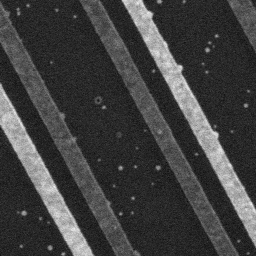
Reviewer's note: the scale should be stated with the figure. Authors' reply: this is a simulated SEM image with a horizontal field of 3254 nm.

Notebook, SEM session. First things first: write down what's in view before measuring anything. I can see lines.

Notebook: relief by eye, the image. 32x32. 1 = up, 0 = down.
00000000001110001100000000000110
10000000000110001110000000000111
10000000000111000110000000000011
11000000000011000111000000000011
11000000000011100011000000000001
11100000000001100011100000000001
01100000000000110001100000000000
01110000000000111001110000000000
00110000000000011000110000000000
00111000000000011100111000000000
00011100000000001100011000000000
10011100000000001110001100000000
10001110000000000110001110000000
11000110000000000111000110000000
11000111000000000011000110000000
11100011000000000011100011000000
01100011100000000001100011100000
01110001100000000001110001100000
00110001110000000000110001110000
00111000110000000000011000110000
00011000111000000000011100111000
00011100011000000000001100011000
00001100011100000000001110011100
00000110001100000000000110001100
00000111001110000000000111000110
00000011000111000000000011000110
00000011100011000000000011100011
00000001100011100000000001100011
00000001110001100000000001110001
00000000110001110000000000110001
00000000111000110000000000011000
00000000011000111000000000011100